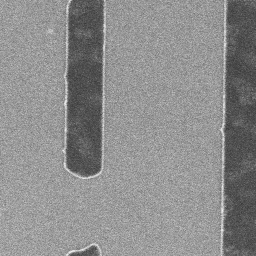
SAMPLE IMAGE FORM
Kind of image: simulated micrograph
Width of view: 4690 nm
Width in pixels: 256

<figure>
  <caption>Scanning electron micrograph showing one or a few lines or trenches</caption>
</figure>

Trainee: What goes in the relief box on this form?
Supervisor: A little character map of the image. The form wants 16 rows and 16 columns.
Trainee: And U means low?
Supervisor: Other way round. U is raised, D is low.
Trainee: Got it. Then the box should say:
DDDDUUUDDDDDDDUU
DDDDUUUDDDDDDDUU
DDDDUUUDDDDDDDUU
DDDDUUUDDDDDDDUU
DDDDUUDDDDDDDDUU
DDDDUUDDDDDDDDUU
DDDDUUDDDDDDDDUU
DDDDUUDDDDDDDDUU
DDDDUUDDDDDDDDUU
DDDDUUDDDDDDDDUU
DDDDUUDDDDDDDDUU
DDDDDDDDDDDDDDUU
DDDDDDDDDDDDDDUU
DDDDDDDDDDDDDDUU
DDDDDDDDDDDDDDUU
DDDDDUDDDDDDDDUU